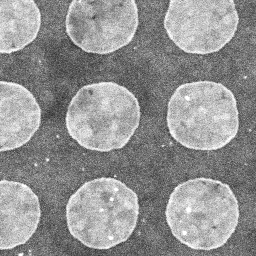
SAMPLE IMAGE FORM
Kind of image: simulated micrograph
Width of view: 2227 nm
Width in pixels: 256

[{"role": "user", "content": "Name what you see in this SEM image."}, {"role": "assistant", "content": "raised bodies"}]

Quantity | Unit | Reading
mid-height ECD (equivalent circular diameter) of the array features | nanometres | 613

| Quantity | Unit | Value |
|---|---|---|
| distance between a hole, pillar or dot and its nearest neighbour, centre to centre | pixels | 97.3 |